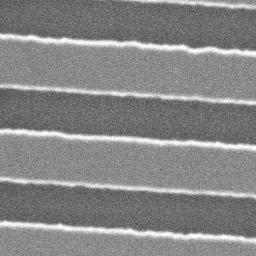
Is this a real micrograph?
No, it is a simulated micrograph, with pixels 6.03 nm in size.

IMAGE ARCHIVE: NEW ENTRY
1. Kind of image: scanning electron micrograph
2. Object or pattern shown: lines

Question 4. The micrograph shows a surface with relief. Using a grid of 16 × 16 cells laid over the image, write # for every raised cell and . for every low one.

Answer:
................
................
#####...........
################
################
.###############
................
................
#####...........
################
################
....############
................
................
#########.......
################